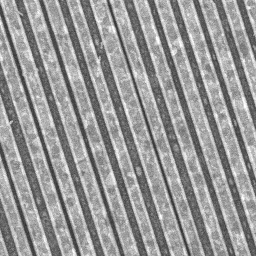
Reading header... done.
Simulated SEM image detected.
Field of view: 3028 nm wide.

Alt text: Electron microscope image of parallel lines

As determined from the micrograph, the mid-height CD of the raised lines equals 152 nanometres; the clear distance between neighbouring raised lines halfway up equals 0.108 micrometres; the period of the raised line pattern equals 0.248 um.